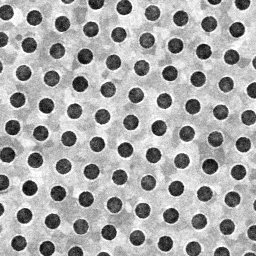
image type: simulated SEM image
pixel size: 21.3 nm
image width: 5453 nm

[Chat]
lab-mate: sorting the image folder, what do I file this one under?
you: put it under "a regular array of holes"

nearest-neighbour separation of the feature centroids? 593 nanometres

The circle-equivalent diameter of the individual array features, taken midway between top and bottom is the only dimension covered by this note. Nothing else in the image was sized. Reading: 0.347 microns